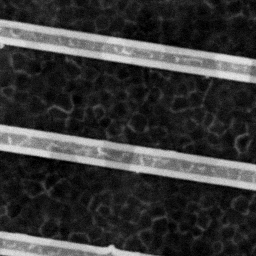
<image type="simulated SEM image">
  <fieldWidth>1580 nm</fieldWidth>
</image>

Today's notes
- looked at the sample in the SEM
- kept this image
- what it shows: one or a few lines or trenches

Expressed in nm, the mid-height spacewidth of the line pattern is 529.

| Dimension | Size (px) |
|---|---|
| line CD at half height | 18.8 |